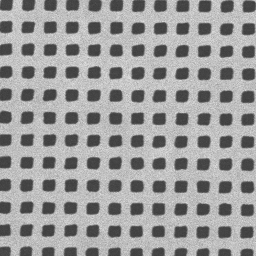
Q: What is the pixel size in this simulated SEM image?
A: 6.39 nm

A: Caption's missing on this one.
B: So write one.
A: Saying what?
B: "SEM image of a regular array of holes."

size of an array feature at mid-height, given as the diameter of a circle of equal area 84.9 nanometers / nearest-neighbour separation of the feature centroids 0.14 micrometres